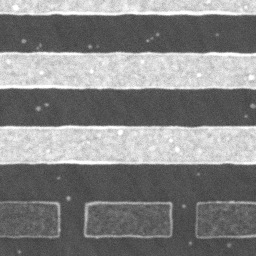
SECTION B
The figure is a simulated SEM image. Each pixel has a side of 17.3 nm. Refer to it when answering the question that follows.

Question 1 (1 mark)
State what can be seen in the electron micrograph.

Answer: wiring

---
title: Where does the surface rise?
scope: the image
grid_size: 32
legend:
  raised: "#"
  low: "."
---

################################
##########################.#####
................................
................................
................................
................................
................................
################################
################################
################################
################################
................................
................................
................................
................................
................................
################################
################################
################################
################################
................................
................................
................................
................................
................................
#######....##########....#######
#######....##########....#######
#######....##########....#######
#######....##########....#######
#######....##########....#######
................................
................................